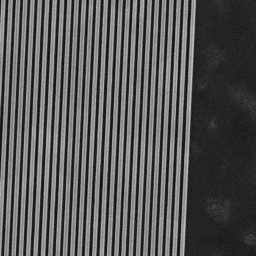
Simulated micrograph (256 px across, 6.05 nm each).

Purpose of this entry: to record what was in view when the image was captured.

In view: parallel lines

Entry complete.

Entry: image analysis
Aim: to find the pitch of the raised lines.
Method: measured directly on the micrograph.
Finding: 7.31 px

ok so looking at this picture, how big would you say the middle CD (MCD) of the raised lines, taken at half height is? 21.9 nm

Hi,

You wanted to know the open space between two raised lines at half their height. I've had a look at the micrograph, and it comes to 21.9 nm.